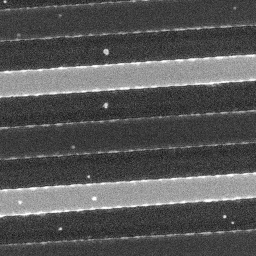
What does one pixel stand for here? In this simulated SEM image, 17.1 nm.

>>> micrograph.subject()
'lines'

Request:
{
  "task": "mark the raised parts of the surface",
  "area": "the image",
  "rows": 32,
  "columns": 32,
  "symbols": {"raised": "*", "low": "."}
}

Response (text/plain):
...........*********************
********************************
********************************
*************************.......
***********.....................
................................
................................
.......................*********
.......*************************
********************************
*************************.......
*********.......................
................................
................................
......................**********
........************************
********************************
********************************
**********************..........
******..........................
................................
................................
....................************
.....***************************
********************************
*********************...........
********........................
................................
................................
...................*************
...*****************************
********************************